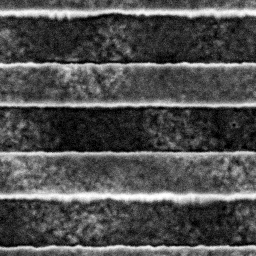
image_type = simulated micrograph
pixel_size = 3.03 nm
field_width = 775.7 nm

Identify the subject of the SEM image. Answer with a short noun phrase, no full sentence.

lines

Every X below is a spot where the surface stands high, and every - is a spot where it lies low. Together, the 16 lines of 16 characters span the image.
XXXXXXXXXXXXXXXX
----------------
----------------
----------------
XXXXXXXXXXXXXXXX
XXXXXXXXXXXXXXXX
XXXXXXXXXXXXXXXX
----------------
----------------
--------------XX
XXXXXXXXXXXXXXXX
XXXXXXXXXXXXXXXX
----------------
----------------
----------------
XXXXXXXXXXXXXXXX